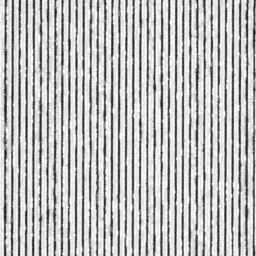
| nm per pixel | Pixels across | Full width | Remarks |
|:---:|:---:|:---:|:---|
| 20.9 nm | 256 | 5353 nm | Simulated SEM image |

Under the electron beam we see parallel lines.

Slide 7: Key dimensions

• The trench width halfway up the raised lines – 0.0732 µm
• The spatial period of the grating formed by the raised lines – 0.149 microns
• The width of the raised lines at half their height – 73.2 nanometers